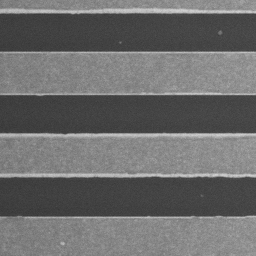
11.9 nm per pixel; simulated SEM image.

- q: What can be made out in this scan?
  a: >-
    lines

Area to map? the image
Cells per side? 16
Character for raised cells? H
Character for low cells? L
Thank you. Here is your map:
HHHHHHHHHHHHHHHH
LLLLLLLLLLLLLLLL
LLLLLLLLLLLLLLLL
HHHHHHHHHHHHHHHH
HHHHHHHHHHHHHHHH
HHHHHHHHHHHHHHHH
LLLLLLLLLLLLLLLL
LLLLLLLLLLLLLLLL
HHHHHHHHHHHHHHHH
HHHHHHHHHHHHHHHH
HHHHHHHHHHHHHHHH
LLLLLLLLLLLLLLLL
LLLLLLLLLLLLLLLL
LLLLLLLLLLLLLLLL
HHHHHHHHHHHHHHHH
HHHHHHHHHHHHHHHH